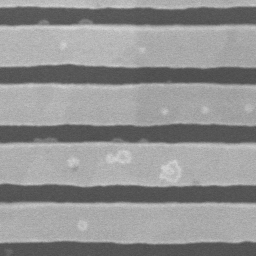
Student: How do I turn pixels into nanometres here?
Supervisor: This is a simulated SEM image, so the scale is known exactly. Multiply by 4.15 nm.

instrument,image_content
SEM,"lines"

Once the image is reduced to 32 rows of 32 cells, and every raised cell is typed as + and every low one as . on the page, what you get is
++++++++++++++++++++++++++++++++
................................
................................
++++++++++++++++++++++++++++++++
++++++++++++++++++++++++++++++++
++++++++++++++++++++++++++++++++
++++++++++++++++++++++++++++++++
++++++++++++++++++++++++++++++++
........................++......
................................
...++.+..........+.++.+++++.....
++++++++++++++++++++++++++++++++
++++++++++++++++++++++++++++++++
++++++++++++++++++++++++++++++++
++++++++++++++++++++++++++++++++
++++++++++++++++++++++..++++++++
................................
................................
++++++++++++++++++++++++++++++++
++++++++++++++++++++++++++++++++
++++++++++++++++++++++++++++++++
++++++++++++++++++++++++++++++++
++++++++++++++++++++++++++++++++
................................
................................
++++++++++++++++++++++++++++++++
++++++++++++++++++++++++++++++++
++++++++++++++++++++++++++++++++
++++++++++++++++++++++++++++++++
++++++++++++++++++++++++++++++++
...................+............
................................